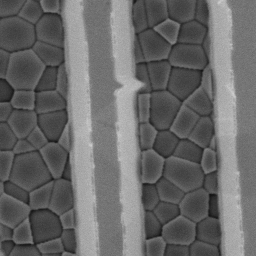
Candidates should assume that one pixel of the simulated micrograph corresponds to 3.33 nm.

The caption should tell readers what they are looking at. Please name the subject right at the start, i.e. one or a few lines or trenches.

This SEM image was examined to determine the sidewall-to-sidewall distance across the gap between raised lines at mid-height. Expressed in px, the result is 99.2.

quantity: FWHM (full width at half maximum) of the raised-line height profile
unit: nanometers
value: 153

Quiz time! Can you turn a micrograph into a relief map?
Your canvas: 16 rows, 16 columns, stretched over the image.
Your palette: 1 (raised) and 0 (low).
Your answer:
0000111100000011
0000011100000011
0000011100000011
0000011100000011
0000011100000011
0000011100000011
0000011100000011
0000011100000011
0000011100000011
0000011100000011
0000011100000011
0000011100000011
0000011100000011
0000011100000011
0000011100000011
0000011100000001